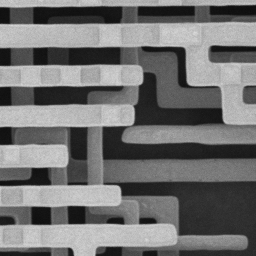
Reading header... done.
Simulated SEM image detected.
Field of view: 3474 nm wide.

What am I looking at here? wiring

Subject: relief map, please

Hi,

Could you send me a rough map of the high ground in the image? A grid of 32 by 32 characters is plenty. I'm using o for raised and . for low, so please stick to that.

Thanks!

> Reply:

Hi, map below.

oooooooooooooooooooooooooooooooo
................................
................................
oooooooooooooooooooooooooooooooo
oooooooooooooooooooooooooooooooo
oooooooooooooooooooooooooooooooo
.......................ooo......
.......................ooo......
oooooooooooooooooo.....ooooooooo
oooooooooooooooooo.....ooooooooo
oooooooooooooooooo......oooooooo
............................oo..
............................oo..
ooooooooooooooooo...........oooo
ooooooooooooooooo...........oooo
oooooooooooooooo............oooo
................................
................................
oooooooo........................
oooooooo........................
oooooooo........................
................................
................................
ooooooooooooooo.................
ooooooooooooooo.................
ooooooooooooooo.................
................................
................................
oooooooooooooooooooooo..........
oooooooooooooooooooooo..........
oooooooooooooooooooooo..........
.........ooo....................